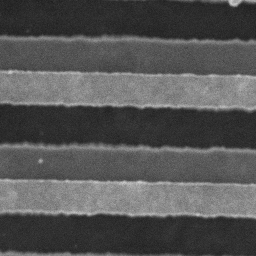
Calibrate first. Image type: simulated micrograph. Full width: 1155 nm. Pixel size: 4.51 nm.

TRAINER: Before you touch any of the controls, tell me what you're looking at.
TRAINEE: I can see lines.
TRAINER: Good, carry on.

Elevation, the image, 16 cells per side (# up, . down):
................
................
##########......
################
################
################
....############
................
................
################
################
################
################
..............##
................
................